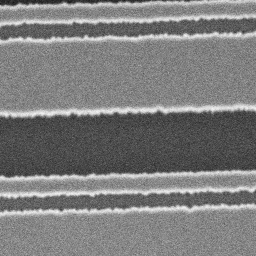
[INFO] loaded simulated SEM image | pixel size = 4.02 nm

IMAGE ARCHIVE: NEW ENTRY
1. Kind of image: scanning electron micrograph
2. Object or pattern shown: lines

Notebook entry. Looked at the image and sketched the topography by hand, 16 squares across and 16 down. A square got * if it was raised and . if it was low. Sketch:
****************
****************
****************
****************
****************
****************
****************
................
................
................
................
****************
****************
****************
****************
****************